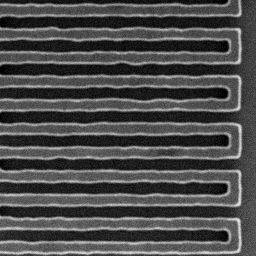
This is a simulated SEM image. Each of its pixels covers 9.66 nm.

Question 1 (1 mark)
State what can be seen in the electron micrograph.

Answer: groups of lines, slits or small figures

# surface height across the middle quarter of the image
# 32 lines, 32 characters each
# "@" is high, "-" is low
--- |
--------------------------------
--------------------------------
--------------------------------
@@@@@@@@@@@@@@@@@@@@@@@@@@@@@@@@
@@@@@@@@@@@@@@@@@@@@@@@@@@@@@@@@
@@@@@@@----@@@@@@@@---@@@@@@@@@@
--------------------------------
--------------------------------
--------------------------------
@@@@@@@@@@@@@@@@@@@--@@@@@@@@@@@
@@@@@@@@@@@@@@@@@@@@@@@@@@@@@@@@
@@@@@@@@@@@@-@@@@@@@@@@@@@@---@@
--------------------------------
--------------------------------
--------------------------------
@@@@@@@@@@@@@@@@@@@@@@@@@@@@@@@@
@@@@@@@@@@@@@@@@@@@@@@@@@@@@@@@@
@@@-@@--@---@@@@@@@@@@@@@@@@-@@@
--------------------------------
--------------------------------
--------------------------------
@@@@@@@@@@@@@@@@@@@@@@@@@@@@@@@@
@@@@@@@@@@@@@@@@@@@@@@@@@@@@@@@@
-@@-----@@@---------------------
--------------------------------
--------------------------------
--------------------------------
@@@@@@@@@@@@@@@@@@@@@@@@@@@@@@@@
@@@@@@@@@@@@@@@@@@@@@@@@@@@@@@@@
-----------------------------@--
--------------------------------
--------------------------------